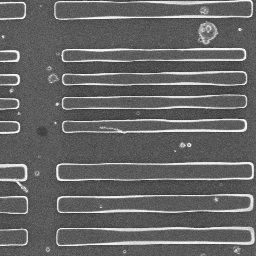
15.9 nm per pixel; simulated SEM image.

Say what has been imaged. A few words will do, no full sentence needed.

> groups of lines, slits or small figures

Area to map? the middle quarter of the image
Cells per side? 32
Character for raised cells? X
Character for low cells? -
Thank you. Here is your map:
--------------------------------
--------------------------------
--------------XXX------XXXXXXXXX
XXXXXXXXXXXXXXXXXXXXXXXXXXXXXXXX
XXXXXXXXXXXXXXXXXXXXXXXXXXXXXXXX
--------------------------------
--------------------------------
--------------------------------
XXXXX---XXXXXXXXXXXXXXXXXXXXXXXX
XXXXXXXXXXXXXXXXXXXXXXXXXXXXXXXX
XXXXXXXXXXXXXXXXXXXXXXXXXXXXXXXX
--------------------------------
--------------------------------
--------------------------------
XXXXXXXXXXXXXXXXXXXXXXXXXXXXXXXX
XXXXXXXXXXXXXXXXXXXXXXXXXXXXXXXX
XXXXXXXXXXXXXXXXXXXXXXXXXXXXXXXX
--------------------------------
--------------------------------
--------------------------------
--------------------------------
--------------------------------
--------------------------------
--------------------------------
--------------------------------
XXXXXXXXXXXXXXXXXXXXXXXXXXXXXXXX
XXXXXXXXXXXXXXXXXXXXXXXXXXXXXXXX
XXXXXXXXXXXXXXXXXXXXXXXXXXXXXXXX
XXXXXXXXXXXXXXXXXXXXXXXXXXXXXXXX
--------------------------------
--------------------------------
--------------------------------